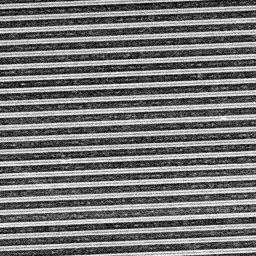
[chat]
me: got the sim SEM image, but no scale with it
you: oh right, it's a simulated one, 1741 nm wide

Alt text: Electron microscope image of parallel lines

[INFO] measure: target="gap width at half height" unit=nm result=56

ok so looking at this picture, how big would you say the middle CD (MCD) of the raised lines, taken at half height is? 3.62 px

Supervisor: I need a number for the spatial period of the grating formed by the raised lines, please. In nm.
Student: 82.2